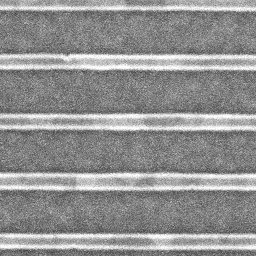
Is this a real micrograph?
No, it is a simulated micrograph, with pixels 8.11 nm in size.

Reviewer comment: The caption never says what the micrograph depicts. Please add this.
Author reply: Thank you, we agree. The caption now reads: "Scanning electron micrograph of parallel lines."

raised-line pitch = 485 nm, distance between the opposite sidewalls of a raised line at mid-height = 102 nanometers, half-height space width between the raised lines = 380 nm